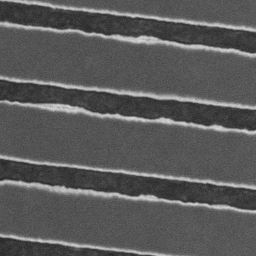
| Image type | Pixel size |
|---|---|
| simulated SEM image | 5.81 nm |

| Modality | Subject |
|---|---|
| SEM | lines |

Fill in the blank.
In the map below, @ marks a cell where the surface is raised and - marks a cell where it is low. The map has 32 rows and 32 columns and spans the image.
----@@@@@@@@@@@@@@@@@@@@@@@@@@@@
-----------@@@@@@@@@@@@@@@@@@@@@
--------------------@@@@@@@@@@@@
@@@@@-----------------------@@@@
@@@@@@@@@@@@@-------------------
@@@@@@@@@@@@@@@@@@@@@@----------
@@@@@@@@@@@@@@@@@@@@@@@@@@@@@@--
@@@@@@@@@@@@@@@@@@@@@@@@@@@@@@@@
@@@@@@@@@@@@@@@@@@@@@@@@@@@@@@@@
@@@@@@@@@@@@@@@@@@@@@@@@@@@@@@@@
-----@@@@@@@@@@@@@@@@@@@@@@@@@@@
-------------@@@@@@@@@@@@@@@@@@@
----------------------@@@@@@@@@@
@@@@@@------------------------@@
@@@@@@@@@@@@@@@-----------------
@@@@@@@@@@@@@@@@@@@@@@@@--------
@@@@@@@@@@@@@@@@@@@@@@@@@@@@@@@@
@@@@@@@@@@@@@@@@@@@@@@@@@@@@@@@@
@@@@@@@@@@@@@@@@@@@@@@@@@@@@@@@@
@@@@@@@@@@@@@@@@@@@@@@@@@@@@@@@@
----@@@@@@@@@@@@@@@@@@@@@@@@@@@@
--------------@@@@@@@@@@@@@@@@@@
----------------------@@@@@@@@@@
@@@@@@@-----------------------@@
@@@@@@@@@@@@@@@@----------------
@@@@@@@@@@@@@@@@@@@@@@@@@-------
@@@@@@@@@@@@@@@@@@@@@@@@@@@@@@@@
@@@@@@@@@@@@@@@@@@@@@@@@@@@@@@@@
@@@@@@@@@@@@@@@@@@@@@@@@@@@@@@@@
@@@@@@@@@@@@@@@@@@@@@@@@@@@@@@@@
-------@@@@@@@@@@@@@@@@@@@@@@@@@
---------------@@@@@@@@@@@@@@@@@